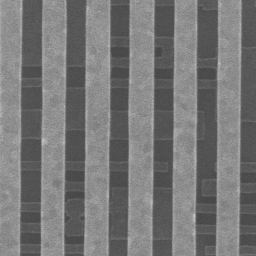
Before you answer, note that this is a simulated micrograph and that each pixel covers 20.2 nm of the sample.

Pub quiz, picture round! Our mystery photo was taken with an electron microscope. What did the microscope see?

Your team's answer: wiring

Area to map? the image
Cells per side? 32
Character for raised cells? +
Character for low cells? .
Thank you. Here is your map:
+++..+++...+++..+++...+++..+++..
+++..+++...+++..+++...+++..+++..
+++..+++...+++..+++...+++..+++..
+++..+++...+++..+++...+++..+++..
+++..+++...+++..+++...+++..+++..
+++..+++...+++..+++...+++..+++..
+++..+++...+++..+++...+++..+++..
+++..+++...+++..+++...+++..+++..
+++..+++...+++..+++...+++..+++..
+++..+++...+++..+++...+++..+++..
+++..+++...+++..+++...+++..+++..
+++..+++...+++..+++...+++..+++..
+++..+++...+++..+++...+++..+++..
+++..+++...+++..+++...+++..+++..
+++..+++...+++..+++...+++..+++..
+++..+++...+++..+++...+++..+++..
+++..+++...+++..+++...+++..+++..
+++..+++...+++..+++...++...+++..
+++..+++...+++..+++...++...+++..
+++..+++...+++..+++...++...+++..
+++..+++...+++..+++...++...+++..
+++..+++...+++..+++...++...+++..
+++..+++...+++..+++...++...+++..
+++..+++...+++..+++...++...+++..
+++..+++...+++..+++...++...+++..
+++..+++...++...+++...++...+++..
+++..+++...++...+++...++...+++..
++...+++...++...+++...++...+++..
++...+++...++...+++...++...+++..
++...+++...++...+++...++...+++..
++...+++...++...+++...++...+++..
++...+++...++...+++...++...+++..